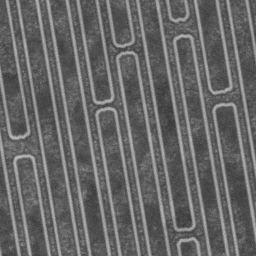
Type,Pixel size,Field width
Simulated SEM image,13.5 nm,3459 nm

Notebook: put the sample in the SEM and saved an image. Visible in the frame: parallel lines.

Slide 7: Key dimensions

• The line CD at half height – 147 nm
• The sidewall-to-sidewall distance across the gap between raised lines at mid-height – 256 nm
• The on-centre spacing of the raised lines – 397 nanometers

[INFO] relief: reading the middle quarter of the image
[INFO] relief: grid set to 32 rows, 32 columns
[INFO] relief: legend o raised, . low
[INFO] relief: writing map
....oo.....ooo....ooo.....oo....
....oo.....ooo.....oo.....ooo...
....ooo....ooo.....oo.....ooo...
....ooo....ooo.....ooo.....oo...
....ooo.....oo.....ooo.....oo...
....ooo.....oo.....ooo.....oo...
.....oo.....ooo....ooo.....oo...
.....oo.....ooo.....oo.....ooo..
.....ooo....ooo.....oo.....ooo..
.....ooo..ooooo.....ooo.....oo..
.....oooooooooo.....ooo.....oo..
.....oooo...ooo.....ooo.....oo..
o.....oo.....ooo....ooo.....oo..
o.....oo.....ooo.....oo.....ooo.
o.....oo.....ooo.....oo.....ooo.
o.....ooo....ooo.....ooo.....oo.
o.....ooo.....oo.....ooo.....oo.
o.....ooo.....oo.....ooo.....oo.
oo.....oo.....ooo....ooo.....oo.
oo.....oo.....ooo.....oo.....ooo
oo.....oo.....ooo.....oo.....ooo
oo.....ooo....ooo.....ooo.....oo
oo.....ooo.....oo.....ooo.....oo
oo.....ooo.....oo.....ooo.....oo
ooo.....oo.....ooo....ooo.....oo
ooo.....oo.....ooo.....oo.....oo
ooo.....oo.....ooo.....oo.....oo
ooo.....ooo....ooo.....ooo.....o
.oo.....ooo.....oo.....ooo.....o
.oo.....ooo.....oo.....ooo.....o
.ooo.....oo.....ooo....ooo.....o
.ooo.....oo.....ooo.....oo.....o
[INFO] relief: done